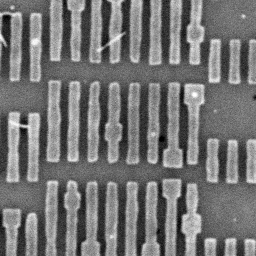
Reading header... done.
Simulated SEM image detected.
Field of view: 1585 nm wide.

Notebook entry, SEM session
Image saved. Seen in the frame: wiring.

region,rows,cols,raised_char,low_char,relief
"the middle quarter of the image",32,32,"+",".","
................................
................................
................................
................................
................................
.+++...++...++...++..+++..+++.++
.+++...++..+++...++..+++..+++.++
.+++...+...+++..+++..+++..+++.++
.+++...+...+++..+++..+++..+++.++
.++....+...+++..+++..+++..+++.++
.++....++..+++..+++..+++..+++..+
.+++..+++..+++..+++..+++..++...+
.+++..+++..+++..+++..++...++...+
.+++..+++..+++..+++..++...++...+
.++...+++..+++..+++..++...++...+
.++...++..++++..+++..+++..++...+
.++...++..++++..+++..+++..++...+
.++...++..++++..+++..+++..++...+
.++...++..++++..+++..++...++...+
.++...++...+++..++...++...++...+
.++...++...++...++...++...++...+
.++...++...++...++...++..++++..+
.++...++...++...++...++..+++++.+
.++...++...++...+++..++..+++++.+
................++....+..+++++.+
.........................++++...
................................
................................
................................
.+.......................++++...
.++...++...++...++...++..++++..+
.++...++...++...++...++..++++..+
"